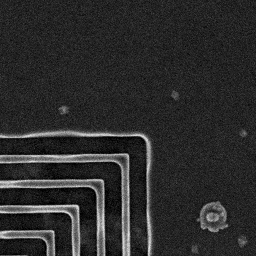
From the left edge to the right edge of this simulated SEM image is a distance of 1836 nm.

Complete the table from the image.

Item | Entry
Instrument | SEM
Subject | groups of lines, slits or small figures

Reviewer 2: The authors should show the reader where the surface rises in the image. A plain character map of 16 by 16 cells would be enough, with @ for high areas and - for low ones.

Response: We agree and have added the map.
@@@@@@@@@@@@@@@@
@@@@@@@@@@@@@@@@
@@@@@@@@@@@@@@@@
@@@@@@@@@@@@@@@@
@@@@@@@@@@@@@@@@
@@@@@@@@@@@@@@@@
@@@@@@@@@@@@@@@@
@@@@@@@@@@@@@@@@
@@-------@@@@@@@
---------@@@@@@@
-------@-@@@@@@@
-----@---@@@@@@@
---------@@@@@@@
----@----@@@@@@@
--@------@@@@@@@
---------@@@@@@@